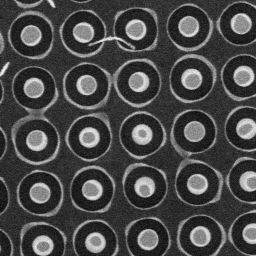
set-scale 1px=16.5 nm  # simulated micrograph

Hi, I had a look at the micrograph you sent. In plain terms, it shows an array of small figures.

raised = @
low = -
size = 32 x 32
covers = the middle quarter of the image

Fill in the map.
@@@-----@@@@@@@-------@@@@@@----
@@--------@@@@---------@@@@-----
@----------@@----@@-----@@@---@@
----@@@----@@---@@@@----@@@---@@
----@@@@----@---@@@@@---@@@---@@
----@@@@---@@---@@@@----@@@---@@
----@@@@---@@-----------@@@-----
-----@@----@@@---------@@@@@----
@----------@@@@-------@@@@@@@---
@@--------@@@@@@-----@@@@@@@@@@@
@@@@----@@@@@@@@@@-@@@@@@@@@@@@@
@@@@@@@@@@@@@@@@@@@@@@@@@@@@@@@@
@@@@@@@@@@@@@@@@@@---@@@@@@@@---
@@@@------@@@@@@-------@@@@@----
@@@--------@@@@---------@@@@----
@@---------@@@----------@@@---@@
@----@@----@@@----@@@----@@---@@
@---@@@@----@@----@@@----@@---@@
@---@@@@----@@----@@@----@@----@
@---@@@@----@@-----------@@-----
@----------@@@@---------@@@@----
@@---------@@@@@-------@@@@@@---
@@@-------@@@@@@@-----@@@@@@@@@@
@@@@----@@@@@@@@@@@@@@@@@@@@@@@@
@@@@@@@@@@@@@@@@@@@@@@@@@@@@@@--
@@@@@@@@@@@@@@@@@----@@@@@@@@---
@@@@------@@@@@@-------@@@@@@---
@@@--------@@@@----------@@@----
@@@---------@@@----------@@@---@
@@----@@----@@@----@@----@@@---@
@@---@@@@----@@---@@@@----@@---@
@@---@@@@---@@@---@@@@----@@----